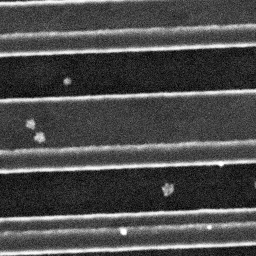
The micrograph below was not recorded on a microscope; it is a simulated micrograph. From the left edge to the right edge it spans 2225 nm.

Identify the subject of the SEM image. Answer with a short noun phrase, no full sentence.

lines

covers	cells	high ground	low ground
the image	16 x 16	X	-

XXXXXXXXXXXXXXXX
XXXXXXXXXXXXXXXX
XXXXXXXXXXXXXXXX
----------------
----------------
----------------
XXXXXXXXXXXXXXXX
XXXXXXXXXXXXXXXX
XXXXXXXXXXXXXXXX
XXXXXXXXXXXXXXXX
XXXXXX----------
----------------
----------------
-----XXXXXXXXXXX
XXXXXXXXXXXXXXXX
XXXXXXXXXXX-----